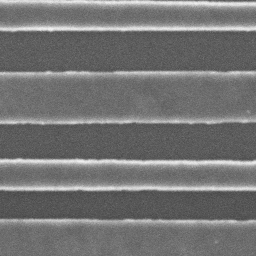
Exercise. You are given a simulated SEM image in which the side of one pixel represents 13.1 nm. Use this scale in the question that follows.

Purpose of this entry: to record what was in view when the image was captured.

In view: lines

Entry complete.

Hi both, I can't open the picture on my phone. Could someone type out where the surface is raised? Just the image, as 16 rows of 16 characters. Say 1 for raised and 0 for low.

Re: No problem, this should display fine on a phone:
1111111111111111
1111111111111111
0000000000000000
0000000000000000
0000000000000000
1111111111111111
1111111111111111
1111111111111111
0000000000000000
0000000000000000
1111111111111111
1111111111111111
0000000000000000
0000000000000000
1111111111111111
1111111111111111